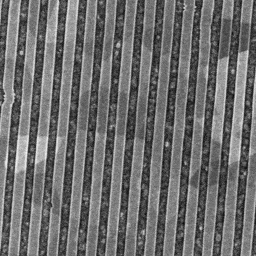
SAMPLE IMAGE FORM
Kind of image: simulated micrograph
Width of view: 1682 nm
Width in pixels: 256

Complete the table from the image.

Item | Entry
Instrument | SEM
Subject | parallel lines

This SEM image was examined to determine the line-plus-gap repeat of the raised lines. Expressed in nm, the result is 127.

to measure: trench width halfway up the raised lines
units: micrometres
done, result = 0.0613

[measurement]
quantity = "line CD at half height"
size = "9.95 pixels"